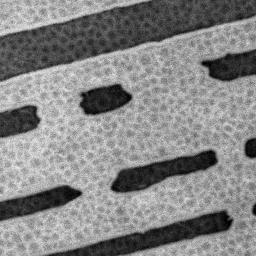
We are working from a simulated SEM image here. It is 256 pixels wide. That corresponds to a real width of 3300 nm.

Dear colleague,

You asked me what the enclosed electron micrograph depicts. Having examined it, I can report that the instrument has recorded one or a few lines or trenches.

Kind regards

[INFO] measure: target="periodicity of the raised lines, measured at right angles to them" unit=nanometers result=915